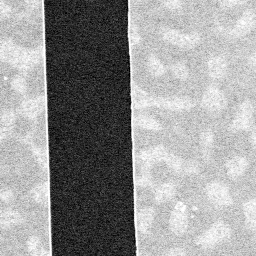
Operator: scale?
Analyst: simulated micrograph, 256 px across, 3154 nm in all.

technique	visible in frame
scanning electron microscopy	one or a few lines or trenches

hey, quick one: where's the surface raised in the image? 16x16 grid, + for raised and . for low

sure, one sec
+++.....++++++++
+++.....++++++++
+++.....++++++++
+++.....++++++++
+++.....++++++++
+++.....++++++++
+++.....++++++++
+++.....++++++++
+++.....++++++++
+++.....++++++++
+++.....++++++++
+++.....++++++++
+++.....++++++++
+++.....++++++++
+++.....++++++++
+++......+++++++